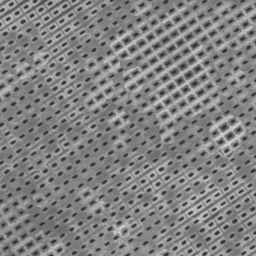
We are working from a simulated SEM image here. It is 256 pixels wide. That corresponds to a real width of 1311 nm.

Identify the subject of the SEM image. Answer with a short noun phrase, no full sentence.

a regular array of holes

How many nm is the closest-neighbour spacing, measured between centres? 53.1